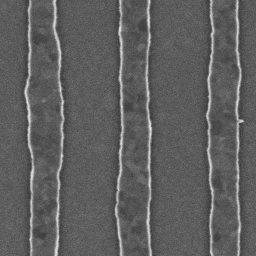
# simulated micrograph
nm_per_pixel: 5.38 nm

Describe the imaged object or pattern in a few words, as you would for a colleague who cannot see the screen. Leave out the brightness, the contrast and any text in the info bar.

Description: one or a few lines or trenches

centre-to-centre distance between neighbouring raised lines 483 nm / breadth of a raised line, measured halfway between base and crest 151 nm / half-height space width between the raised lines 328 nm